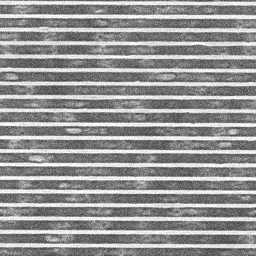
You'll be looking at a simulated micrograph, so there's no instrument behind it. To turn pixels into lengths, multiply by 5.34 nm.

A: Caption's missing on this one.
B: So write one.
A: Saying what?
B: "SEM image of parallel lines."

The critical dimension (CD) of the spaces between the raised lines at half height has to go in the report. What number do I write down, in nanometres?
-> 56.7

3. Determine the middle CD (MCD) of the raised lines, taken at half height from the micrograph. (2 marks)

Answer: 15.3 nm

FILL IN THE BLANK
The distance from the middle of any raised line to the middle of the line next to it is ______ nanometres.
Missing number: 71.9